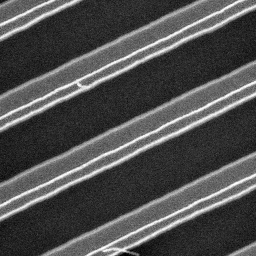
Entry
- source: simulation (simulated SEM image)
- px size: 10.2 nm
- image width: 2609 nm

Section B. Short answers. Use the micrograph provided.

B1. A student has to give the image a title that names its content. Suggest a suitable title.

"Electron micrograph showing lines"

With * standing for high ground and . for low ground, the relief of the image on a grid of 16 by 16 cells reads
****........****
**........****..
.......*****....
.....*****......
...*****.......*
.****........***
***........****.
*.......*****...
......*****.....
....*****.......
..*****.......**
****........****
**........****..
........****....
......****......
....****.......*